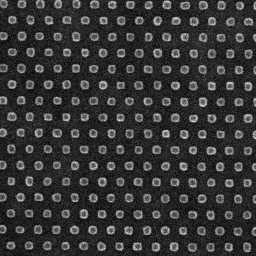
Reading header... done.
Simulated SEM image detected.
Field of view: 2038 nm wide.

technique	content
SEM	a regular array of raised bodies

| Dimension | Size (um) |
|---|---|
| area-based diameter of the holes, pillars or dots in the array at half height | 0.0648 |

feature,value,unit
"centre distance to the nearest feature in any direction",143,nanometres